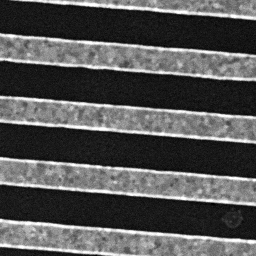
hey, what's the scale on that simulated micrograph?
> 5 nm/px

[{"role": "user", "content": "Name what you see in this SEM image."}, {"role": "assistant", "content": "parallel lines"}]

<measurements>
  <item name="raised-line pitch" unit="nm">309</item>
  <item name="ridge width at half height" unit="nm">123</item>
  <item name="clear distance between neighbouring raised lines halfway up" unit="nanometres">188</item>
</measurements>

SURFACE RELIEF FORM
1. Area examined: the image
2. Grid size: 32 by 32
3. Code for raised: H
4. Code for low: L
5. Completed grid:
LLLLLLLLLLHHHHHHHHHHHHHHHHHHHHHH
LLLLLLLLLLLLLLLLLLLLLLHHHHHHHHHH
LLLLLLLLLLLLLLLLLLLLLLLLLLLLLLLL
LLLLLLLLLLLLLLLLLLLLLLLLLLLLLLLL
HHLLLLLLLLLLLLLLLLLLLLLLLLLLLLLL
HHHHHHHHHHHHHLLLLLLLLLLLLLLLLLLL
HHHHHHHHHHHHHHHHHHHHHHHHHHLLLLLL
LHHHHHHHHHHHHHHHHHHHHHHHHHHHHHHH
LLLLLLLLLLLLLLHHHHHHHHHHHHHHHHHH
LLLLLLLLLLLLLLLLLLLLLLLLLHHHHHHH
LLLLLLLLLLLLLLLLLLLLLLLLLLLLLLLL
LLLLLLLLLLLLLLLLLLLLLLLLLLLLLLLL
HHHHHLLLLLLLLLLLLLLLLLLLLLLLLLLL
HHHHHHHHHHHHHHHHHLLLLLLLLLLLLLLL
HHHHHHHHHHHHHHHHHHHHHHHHHHHHHLLL
LLLLHHHHHHHHHHHHHHHHHHHHHHHHHHHH
LLLLLLLLLLLLLLLLHHHHHHHHHHHHHHHH
LLLLLLLLLLLLLLLLLLLLLLLLLLLLLHHH
LLLLLLLLLLLLLLLLLLLLLLLLLLLLLLLL
LLLLLLLLLLLLLLLLLLLLLLLLLLLLLLLL
HHHHHHHHLLLLLLLLLLLLLLLLLLLLLLLL
HHHHHHHHHHHHHHHHHHHHLLLLLLLLLLLL
HHHHHHHHHHHHHHHHHHHHHHHHHHHHHHHH
LLLLLLLLHHHHHHHHHHHHHHHHHHHHHHHH
LLLLLLLLLLLLLLLLLLLHHHHHHHHHHHHH
LLLLLLLLLLLLLLLLLLLLLLLLLLLLLLLL
LLLLLLLLLLLLLLLLLLLLLLLLLLLLLLLL
LLLLLLLLLLLLLLLLLLLLLLLLLLLLLLLL
HHHHHHHHHHLLLLLLLLLLLLLLLLLLLLLL
HHHHHHHHHHHHHHHHHHHHHHHLLLLLLLLL
HHHHHHHHHHHHHHHHHHHHHHHHHHHHHHHH
LLLLLLLLLLHHHHHHHHHHHHHHHHHHHHHH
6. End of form